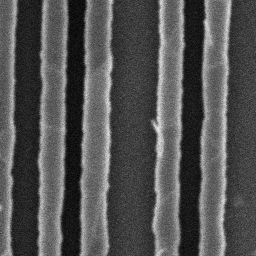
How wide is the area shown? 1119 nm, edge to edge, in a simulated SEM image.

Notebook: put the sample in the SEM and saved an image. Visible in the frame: lines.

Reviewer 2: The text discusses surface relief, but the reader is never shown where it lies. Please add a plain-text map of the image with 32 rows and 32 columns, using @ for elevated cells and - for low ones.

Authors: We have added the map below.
@@---@@@---@@@------@@@---@@@---
@@---@@@---@@@------@@@---@@@---
@@---@@@---@@@------@@@---@@@---
@@---@@@---@@@------@@@---@@----
@@---@@@---@@@------@@@---@@----
@@---@@@---@@@------@@@---@@----
@@---@@@---@@@------@@@--@@@----
@@---@@@---@@@------@@@--@@@----
@@---@@@---@@@------@@@--@@@----
@@---@@@---@@@------@@@--@@@----
@@---@@@---@@@------@@@--@@@----
@@---@@@---@@@------@@@--@@@----
@@---@@@---@@@------@@@--@@@----
@@---@@@--@@@@------@@@---@@----
@@---@@@--@@@@------@@@---@@----
@@---@@@--@@@@------@@@--@@@----
@@---@@@--@@@@------@@@--@@@----
@@---@@@--@@@@------@@@--@@@----
@@---@@@--@@@@------@@---@@@----
@@---@@@--@@@@------@@@--@@@----
@----@@@--@@@@------@@---@@@----
@----@@@--@@@------@@@---@@@----
@@---@@@--@@@------@@@---@@@----
@----@@@--@@@------@@@---@@@----
@----@@@--@@@-------@@---@@@----
@----@@@--@@@------@@@---@@@----
@----@@@--@@@------@@@---@@@----
@----@@---@@@------@@@---@@@----
@----@@---@@@------@@@---@@@----
@----@@@--@@@------@@@---@@@----
@----@@@--@@@@-----@@@---@@@----
@----@@---@@@------@@@---@@@----